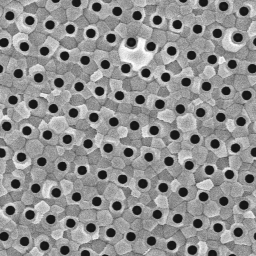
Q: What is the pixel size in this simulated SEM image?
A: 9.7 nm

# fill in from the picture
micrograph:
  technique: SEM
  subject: a regular array of holes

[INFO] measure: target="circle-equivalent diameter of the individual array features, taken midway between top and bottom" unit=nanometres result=91.6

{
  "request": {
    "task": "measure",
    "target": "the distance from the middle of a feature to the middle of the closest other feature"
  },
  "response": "199 nanometres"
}